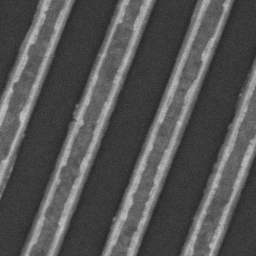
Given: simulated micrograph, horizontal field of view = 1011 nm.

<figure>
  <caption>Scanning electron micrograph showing one or a few lines or trenches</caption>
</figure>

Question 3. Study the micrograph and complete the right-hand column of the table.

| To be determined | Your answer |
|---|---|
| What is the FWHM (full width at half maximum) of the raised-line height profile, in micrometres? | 0.0902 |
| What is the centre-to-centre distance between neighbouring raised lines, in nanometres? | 294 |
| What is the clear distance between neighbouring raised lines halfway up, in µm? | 0.203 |